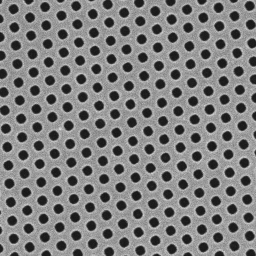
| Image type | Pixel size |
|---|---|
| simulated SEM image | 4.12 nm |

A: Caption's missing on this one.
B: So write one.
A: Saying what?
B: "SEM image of a regular array of holes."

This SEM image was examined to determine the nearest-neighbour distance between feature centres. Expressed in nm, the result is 73.9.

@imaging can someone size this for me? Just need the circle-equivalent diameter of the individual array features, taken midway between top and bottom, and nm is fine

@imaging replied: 41.6